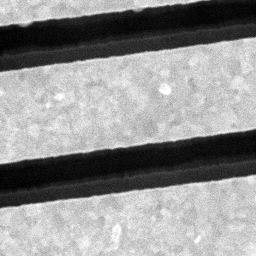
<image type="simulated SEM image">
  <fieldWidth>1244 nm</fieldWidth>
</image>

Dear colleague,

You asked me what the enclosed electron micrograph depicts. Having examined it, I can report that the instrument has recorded lines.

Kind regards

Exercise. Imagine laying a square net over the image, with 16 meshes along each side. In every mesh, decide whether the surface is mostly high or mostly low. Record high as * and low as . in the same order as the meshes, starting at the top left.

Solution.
*********.......
**..............
...............*
........********
****************
****************
****************
****************
*************...
*****...........
................
............****
....************
****************
****************
****************